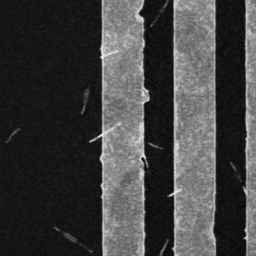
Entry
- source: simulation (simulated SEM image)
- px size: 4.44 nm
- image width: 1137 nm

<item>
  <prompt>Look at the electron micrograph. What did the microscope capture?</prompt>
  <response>one or a few lines or trenches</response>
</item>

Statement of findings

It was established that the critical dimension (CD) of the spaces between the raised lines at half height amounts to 140 nanometres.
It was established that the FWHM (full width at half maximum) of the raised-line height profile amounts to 178 nm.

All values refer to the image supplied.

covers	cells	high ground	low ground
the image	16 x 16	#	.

......###..##..#
......###..##..#
......###..##..#
......###..##..#
......###..##..#
......###..##..#
......###..##..#
......###..##..#
......###..##..#
......###..##..#
......###..##..#
......###..##..#
......###..##..#
......###..##..#
......###..##..#
......###..##..#